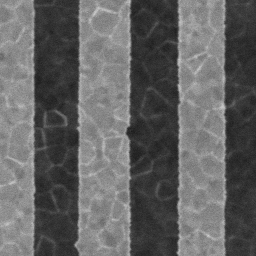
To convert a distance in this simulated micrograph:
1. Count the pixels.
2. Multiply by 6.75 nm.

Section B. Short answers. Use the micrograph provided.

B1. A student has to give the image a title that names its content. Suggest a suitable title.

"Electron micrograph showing one or a few lines or trenches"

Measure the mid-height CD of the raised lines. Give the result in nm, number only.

301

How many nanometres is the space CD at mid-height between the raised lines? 326